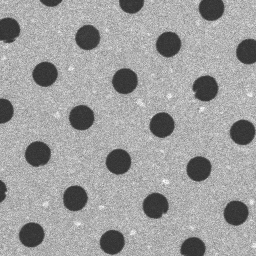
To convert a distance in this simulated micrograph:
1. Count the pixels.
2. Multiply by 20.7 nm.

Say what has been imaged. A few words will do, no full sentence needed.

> a regular array of holes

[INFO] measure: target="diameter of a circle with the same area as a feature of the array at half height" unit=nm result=523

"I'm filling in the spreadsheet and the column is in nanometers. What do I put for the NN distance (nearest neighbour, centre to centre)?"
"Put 1170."